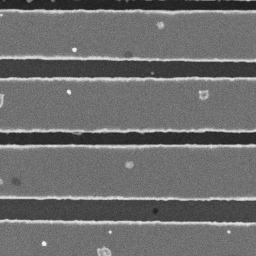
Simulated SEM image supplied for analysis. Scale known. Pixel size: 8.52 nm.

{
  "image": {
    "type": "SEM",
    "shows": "lines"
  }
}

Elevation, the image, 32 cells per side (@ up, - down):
--------------------------------
@@@@@@@@@@@@@@@@@@@@@@@@@@@@@@@@
@@@@@@@@@@@@@@@@@@@@@@@@@@@@@@@@
@@@@@@@@@@@@@@@@@@@@@@@@@@@@@@@@
@@@@@@@@@@@@@@@@@@@@@@@@@@@@@@@@
@@@@@@@@@@@@@@@@@@@@@@@@@@@@@@@@
@@@@@@@@@@@@@@@@@@@@@@@@@@@@@@@@
--------------@@@@@@@@@@@@@@@@@@
--------------------------------
--------------------------------
@@@@@@@@@@@@@@@@@@@@@@@@@@@@@@@@
@@@@@@@@@@@@@@@@@@@@@@@@@@@@@@@@
@@@@@@@@@@@@@@@@@@@@@@@@@@@@@@@@
@@@@@@@@@@@@@@@@@@@@@@@@@@@@@@@@
@@@@@@@@@@@@@@@@@@@@@@@@@@@@@@@@
@@@@@@@@@@@@@@@@@@@@@@@@@@@@@@@@
-----------@---@-------------@--
--------------------------------
@@@@@@@@@@@@@@@@@@@@@@@@@@@@@@@@
@@@@@@@@@@@@@@@@@@@@@@@@@@@@@@@@
@@@@@@@@@@@@@@@@@@@@@@@@@@@@@@@@
@@@@@@@@@@@@@@@@@@@@@@@@@@@@@@@@
@@@@@@@@@@@@@@@@@@@@@@@@@@@@@@@@
@@@@@@@@@@@@@@@@@@@@@@@@@@@@@@@@
@@@@@@@@@@@@@@@@@@@@@@@@@@@@@@@@
--------------------------------
--------------------------------
@-@-----------------------------
@@@@@@@@@@@@@@@@@@@@@@@@@@@@@@@@
@@@@@@@@@@@@@@@@@@@@@@@@@@@@@@@@
@@@@@@@@@@@@@@@@@@@@@@@@@@@@@@@@
@@@@@@@@@@@@@@@@@@@@@@@@@@@@@@@@